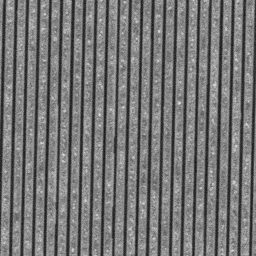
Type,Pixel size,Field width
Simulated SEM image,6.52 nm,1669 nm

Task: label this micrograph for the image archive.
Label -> parallel lines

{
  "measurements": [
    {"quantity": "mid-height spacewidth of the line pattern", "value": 22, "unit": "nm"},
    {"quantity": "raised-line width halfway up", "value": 54.6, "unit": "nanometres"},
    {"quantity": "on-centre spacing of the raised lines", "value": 74.5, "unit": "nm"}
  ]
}